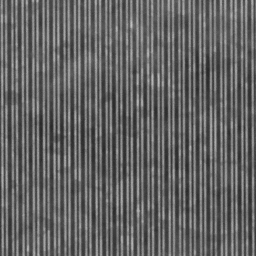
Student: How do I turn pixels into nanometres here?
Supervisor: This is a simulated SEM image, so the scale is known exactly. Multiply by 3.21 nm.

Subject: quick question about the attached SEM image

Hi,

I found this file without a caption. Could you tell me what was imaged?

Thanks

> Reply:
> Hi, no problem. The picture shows parallel lines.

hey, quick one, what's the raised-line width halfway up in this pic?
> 6.4 nm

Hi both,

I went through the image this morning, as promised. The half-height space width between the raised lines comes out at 8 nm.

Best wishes